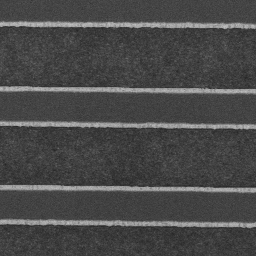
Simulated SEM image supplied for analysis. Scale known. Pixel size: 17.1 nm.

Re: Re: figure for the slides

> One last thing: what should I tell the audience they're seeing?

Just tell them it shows lines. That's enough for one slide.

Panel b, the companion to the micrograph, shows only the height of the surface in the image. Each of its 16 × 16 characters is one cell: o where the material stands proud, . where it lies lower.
oooooooooooooooo
oooooooooooooooo
................
................
................
oo..............
oooooooooooooooo
oooooooooooooooo
................
................
................
................
oooooooooooooooo
oooooooooooooooo
................
................